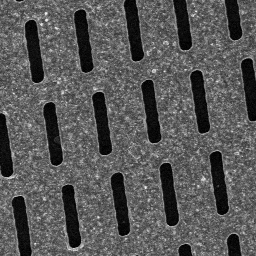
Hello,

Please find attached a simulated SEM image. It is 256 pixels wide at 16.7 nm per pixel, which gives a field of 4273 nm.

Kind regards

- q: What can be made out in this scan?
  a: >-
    a regular array of holes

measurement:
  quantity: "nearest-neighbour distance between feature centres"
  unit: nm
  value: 837